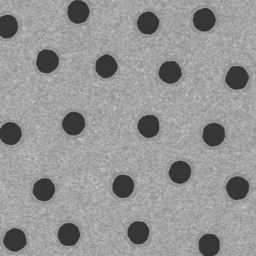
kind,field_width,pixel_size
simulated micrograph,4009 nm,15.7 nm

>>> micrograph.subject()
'a regular array of holes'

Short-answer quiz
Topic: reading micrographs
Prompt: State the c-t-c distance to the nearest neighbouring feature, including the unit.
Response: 0.852 micrometres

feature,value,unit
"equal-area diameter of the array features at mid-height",23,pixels